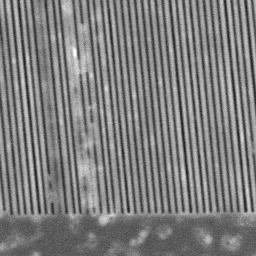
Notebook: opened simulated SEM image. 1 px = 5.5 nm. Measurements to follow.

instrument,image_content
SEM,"parallel lines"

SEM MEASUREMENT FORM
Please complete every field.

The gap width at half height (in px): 1.75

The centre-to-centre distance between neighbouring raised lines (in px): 6.85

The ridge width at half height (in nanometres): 28.1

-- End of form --